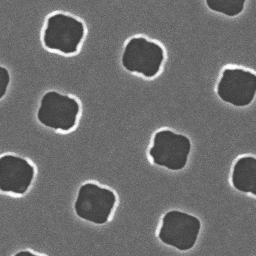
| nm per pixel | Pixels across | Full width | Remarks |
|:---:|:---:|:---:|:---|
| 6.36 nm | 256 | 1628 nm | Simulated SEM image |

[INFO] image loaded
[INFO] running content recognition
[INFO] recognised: holes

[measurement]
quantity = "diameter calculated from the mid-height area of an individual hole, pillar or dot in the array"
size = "0.249 µm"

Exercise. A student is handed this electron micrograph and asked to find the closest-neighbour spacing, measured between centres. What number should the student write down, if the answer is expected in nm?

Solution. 513